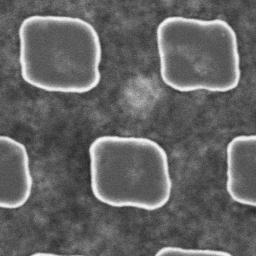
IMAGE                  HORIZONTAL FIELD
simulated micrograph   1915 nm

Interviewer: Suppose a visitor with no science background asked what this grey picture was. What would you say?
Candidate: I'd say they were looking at raised bodies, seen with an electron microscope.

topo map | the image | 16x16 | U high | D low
DDDDDDDDDDDDDDDD
DDUUUDDDDDUUUUDD
DUUUUUDDDDUUUUUD
DUUUUUDDDDUUUUUD
DUUUUUDDDDUUUUUD
DDDUUUDDDDDUUUDD
DDDDDDDDDDDDDDDD
DDDDDDDDDDDDDDDD
DDDDDDDDDDDDDDDD
UUDDDDUUUUDDDDUU
UUDDDDUUUUDDDDUU
UUDDDDUUUUUDDDUU
UUDDDDUUUUDDDDDU
DDDDDDDDDDDDDDDD
DDDDDDDDDDDDDDDD
DDDDDDDDDDDDDDDD